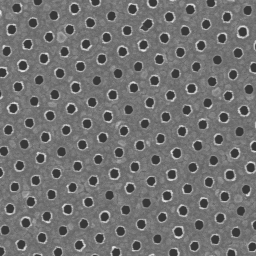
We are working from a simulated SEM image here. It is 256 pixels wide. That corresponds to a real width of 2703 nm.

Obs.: a regular array of holes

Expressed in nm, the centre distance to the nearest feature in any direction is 227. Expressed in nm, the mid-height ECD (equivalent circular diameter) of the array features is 93.8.